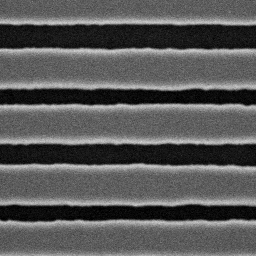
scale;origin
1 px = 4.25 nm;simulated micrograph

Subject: lines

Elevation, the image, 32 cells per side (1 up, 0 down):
11111111111111111111111111111111
11111111111111111111111111111111
11111111111111111111111111111111
00000000000000000000000000000000
00000000000000000000000000000000
00000000000000000000000000000000
11111111111111111111111111111111
11111111111111111111111111111111
11111111111111111111111111111111
11111111111111111111111111111111
11111111111111111111111111111111
00000000000000000000000000000000
00000000000000000000000000000000
11111111111111111111111111111111
11111111111111111111111111111111
11111111111111111111111111111111
11111111111111111111111111111111
11111111111111111111111111111111
00000000000000000000000000000000
00000000000000000000000000000000
00000000000000000000000000000000
11111111111111111111111111111111
11111111111111111111111111111111
11111111111111111111111111111111
11111111111111111111111111111111
11111111111111111111111111111111
00000000000000000000000000000000
00000000000000000000000000000100
11111111111111111111111111111111
11111111111111111111111111111111
11111111111111111111111111111111
11111111111111111111111111111111